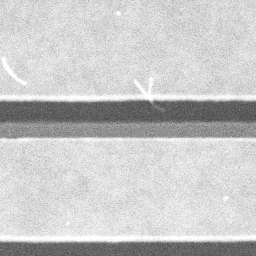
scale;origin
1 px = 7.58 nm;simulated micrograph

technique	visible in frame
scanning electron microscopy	lines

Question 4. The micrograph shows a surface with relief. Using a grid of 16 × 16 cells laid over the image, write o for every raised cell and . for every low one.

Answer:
oooooooooooooooo
oooooooooooooooo
oooooooooooooooo
oooooooooooooooo
oooooooooooooooo
oooooooooooooooo
................
................
................
oooooooooooooooo
oooooooooooooooo
oooooooooooooooo
oooooooooooooooo
oooooooooooooooo
oooooooooooooooo
................